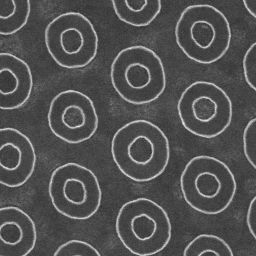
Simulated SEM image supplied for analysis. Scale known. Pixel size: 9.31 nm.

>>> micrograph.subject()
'a regular array of ring-shaped raised bodies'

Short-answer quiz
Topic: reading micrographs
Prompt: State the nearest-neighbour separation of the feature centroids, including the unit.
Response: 0.7 µm